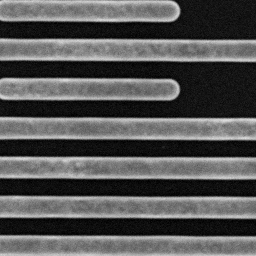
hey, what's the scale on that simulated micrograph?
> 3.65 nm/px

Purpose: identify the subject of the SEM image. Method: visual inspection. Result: groups of lines, slits or small figures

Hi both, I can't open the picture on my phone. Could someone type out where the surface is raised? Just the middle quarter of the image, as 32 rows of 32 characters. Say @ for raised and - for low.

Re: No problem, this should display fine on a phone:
--------------------------------
--------------------------------
--------------------------------
--------------------------------
@@@@@@@@@@@@@@@@@@@@@@@@@@@@----
@@@@@@@@@@@@@@@@@@@@@@@@@@@@@---
@@@@@@@@@@@@@@@@@@@@@@@@@@@@@---
@@@@@@@@@@@@@@@@@@@@@@@@@@@@----
@@@@@@@@@@@@@@@@@@@@@@@@@@@@----
--------------------------------
--------------------------------
--------------------------------
--------------------------------
--------------------------------
@@@@@@@@@@@@@@@@@@@@@@@@@@@@@@@@
@@@@@@@@@@@@@@@@@@@@@@@@@@@@@@@@
@@@@@@@@@@@@@@@@@@@@@@@@@@@@@@@@
@@@@@@@@@@@@@@@@@@@@@@@@@@@@@@@@
@@@@@@@@@@@@@@@@@@@@@@@@@@@@@@@@
--------------------------------
--------------------------------
--------------------------------
--------------------------------
@@@@@@@@@@@@@@@@@@@@@@@@@@@@@@@@
@@@@@@@@@@@@@@@@@@@@@@@@@@@@@@@@
@@@@@@@@@@@@@@@@@@@@@@@@@@@@@@@@
@@@@@@@@@@@@@@@@@@@@@@@@@@@@@@@@
@@@@@@@@@@@@@@@@@@@@@@@@@@@@@@@@
---------------------------@@@@@
--------------------------------
--------------------------------
--------------------------------